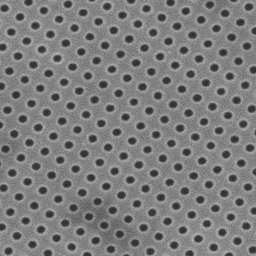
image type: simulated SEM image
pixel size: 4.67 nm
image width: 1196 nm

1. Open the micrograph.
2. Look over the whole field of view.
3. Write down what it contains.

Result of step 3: a regular array of holes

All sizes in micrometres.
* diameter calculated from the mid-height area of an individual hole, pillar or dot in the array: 0.0384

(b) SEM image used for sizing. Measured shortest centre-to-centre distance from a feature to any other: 80.8 nm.